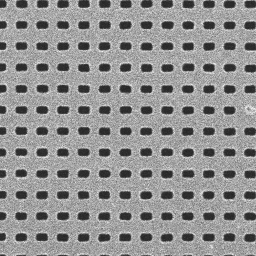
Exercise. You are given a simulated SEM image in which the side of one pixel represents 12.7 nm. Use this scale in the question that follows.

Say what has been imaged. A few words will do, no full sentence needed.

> a regular array of holes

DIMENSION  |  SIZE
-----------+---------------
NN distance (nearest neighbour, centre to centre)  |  262 nanometers